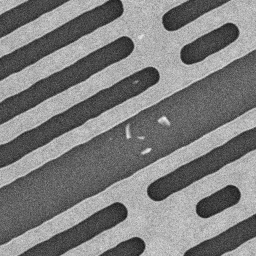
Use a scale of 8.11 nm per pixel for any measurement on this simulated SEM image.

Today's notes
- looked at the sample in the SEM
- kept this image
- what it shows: groups of lines, slits or small figures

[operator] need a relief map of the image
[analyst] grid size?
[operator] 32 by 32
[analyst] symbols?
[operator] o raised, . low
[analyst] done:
ooo.....ooooo..oooooooo.....oooo
o.....ooooo....oooooo.....oooooo
....ooooo.....oooooo....oooooooo
..ooooo.....ooooooooo..oooo...oo
.oooo......oooooooooooooo.....oo
ooo......oooo....oooooo......ooo
o......oooo......oooooo....oooo.
.....ooooo.....oooooooo..oooo...
...ooooo.....ooooo.ooooooooo....
.ooooo.....ooooo....oooooo......
oooo......oooo.....ooooo........
ooo.....oooo......oooo..........
......ooooo.....oooo............
....ooooo.....oooo..............
..ooooo.....oooo..............oo
ooooo.....ooooo.............oooo
ooo......oooo.............oooo..
o......oooo..............oooo...
.....oooo..............oooo.....
...oooo..............oooo......o
.oooo..............oooo......ooo
oooo.............oooo......ooooo
oo.............oooo......ooooooo
.............ooooo.....ooooo..oo
............ooooooo..ooooo....oo
..........oooo.oooooooooo.....oo
........oooo....ooooooooo...oooo
......oooo......oooooooooooooo..
....ooooo.....ooooooooooooooo...
..ooooo.....ooooooooooooooo.....
.oooo.....ooooo...ooooooo.....oo
ooo.....ooooo.....ooooo......ooo